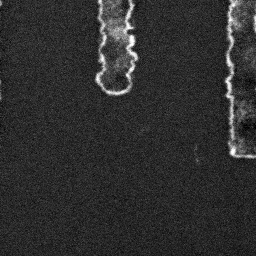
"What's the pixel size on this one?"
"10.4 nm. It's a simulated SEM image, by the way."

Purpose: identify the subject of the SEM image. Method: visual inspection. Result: one or a few lines or trenches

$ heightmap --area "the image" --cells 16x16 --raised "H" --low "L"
LLLLLLHHLLLLLLHH
LLLLLLHHLLLLLLHH
LLLLLLHHLLLLLLHH
LLLLLLHHLLLLLLHH
LLLLLLHHLLLLLLHH
LLLLLLLHLLLLLLHH
LLLLLLLLLLLLLLHH
LLLLLLLLLLLLLLHH
LLLLLLLLLLLLLLHH
LLLLLLLLLLLLLLLH
LLLLLLLLLLLLLLLL
LLLLLLLLLLLLLLLL
LLLLLLLLLLLLLLLL
LLLLLLLLLLLLLLLL
LLLLLLLLLLLLLLLL
LLLLLLLLLLLLLLLL